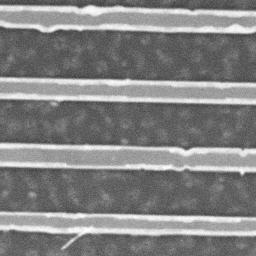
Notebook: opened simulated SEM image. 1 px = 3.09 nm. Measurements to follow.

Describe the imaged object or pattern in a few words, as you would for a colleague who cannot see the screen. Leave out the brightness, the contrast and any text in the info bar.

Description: one or a few lines or trenches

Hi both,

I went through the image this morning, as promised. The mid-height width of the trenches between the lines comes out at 147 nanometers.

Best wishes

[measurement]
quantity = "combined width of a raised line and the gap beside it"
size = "68.3 px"